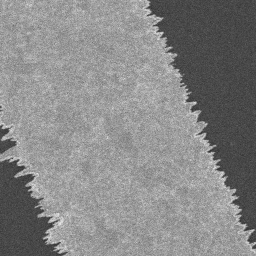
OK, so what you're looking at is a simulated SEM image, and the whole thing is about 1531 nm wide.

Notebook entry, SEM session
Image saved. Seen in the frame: one or a few lines or trenches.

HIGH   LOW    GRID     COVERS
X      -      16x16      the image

XXXXXXXXX-------
XXXXXXXXXX------
XXXXXXXXXX------
XXXXXXXXXXX-----
XXXXXXXXXXX-----
XXXXXXXXXXXX----
XXXXXXXXXXXX----
XXXXXXXXXXXXX---
-XXXXXXXXXXXX---
XXXXXXXXXXXXX---
-XXXXXXXXXXXXX--
--XXXXXXXXXXXX--
--XXXXXXXXXXXXX-
---XXXXXXXXXXXX-
---XXXXXXXXXXXX-
----XXXXXXXXXXXX